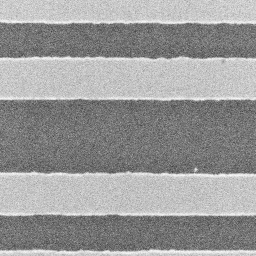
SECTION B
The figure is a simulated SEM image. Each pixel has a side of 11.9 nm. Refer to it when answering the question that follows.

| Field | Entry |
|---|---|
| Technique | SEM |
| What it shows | lines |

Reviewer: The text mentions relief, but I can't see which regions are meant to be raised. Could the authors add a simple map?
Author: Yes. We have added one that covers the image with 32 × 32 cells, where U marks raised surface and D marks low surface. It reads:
UUUUUUUUUUUUUUUUUUUUUUUUUUUUUUUU
UUUUUUUUUUUUUUUUUUUUUUUUUUUUUUUU
UUUUUUUUUUUUUUUUUUUUUUUUUUUUUUUU
DDDDDDDDDDDDDDDDDDDDDDDDDDDDDDDD
DDDDDDDDDDDDDDDDDDDDDDDDDDDDDDDD
DDDDDDDDDDDDDDDDDDDDDDDDDDDDDDDD
DDDDDDDDDDDDDDDDDDDDDDDDDDDDDDDD
UUUUUUUUUUUUUUUUUUUUUUUUUUUUUUUU
UUUUUUUUUUUUUUUUUUUUUUUUUUUUUUUU
UUUUUUUUUUUUUUUUUUUUUUUUUUUUUUUU
UUUUUUUUUUUUUUUUUUUUUUUUUUUUUUUU
UUUUUUUUUUUUUUUUUUUUUUUUUUUUUUUU
DDDDDDDDDDDDDDDDDDDDDDDDDDDDDDDD
DDDDDDDDDDDDDDDDDDDDDDDDDDDDDDDD
DDDDDDDDDDDDDDDDDDDDDDDDDDDDDDDD
DDDDDDDDDDDDDDDDDDDDDDDDDDDDDDDD
DDDDDDDDDDDDDDDDDDDDDDDDDDDDDDDD
DDDDDDDDDDDDDDDDDDDDDDDDDDDDDDDD
DDDDDDDDDDDDDDDDDDDDDDDDDDDDDDDD
DDDDDDDDDDDDDDDDDDDDDDDDDDDDDDDD
DDDDDDDDDDDDDDDDDDDDDDDDDDDDDDDD
DDDDDDDDDDDDDDDDDDDDDDDDDDDDDDDD
UUUUUUUUUUUUUUUUUUUUUUUUUUUUUUUU
UUUUUUUUUUUUUUUUUUUUUUUUUUUUUUUU
UUUUUUUUUUUUUUUUUUUUUUUUUUUUUUUU
UUUUUUUUUUUUUUUUUUUUUUUUUUUUUUUU
UUUUUUUUUUUUUUUUUUUUUUUUUUUUUUUU
DDDDDDDDDDDDDDDDDDDDDDDDDDDDDDDD
DDDDDDDDDDDDDDDDDDDDDDDDDDDDDDDD
DDDDDDDDDDDDDDDDDDDDDDDDDDDDDDDD
DDDDDDDDDDDDDDDDDDDDDDDDDDDDDDDD
UUUUUUUDDUUUDDDDDDUUUUUUUUDDDUUU